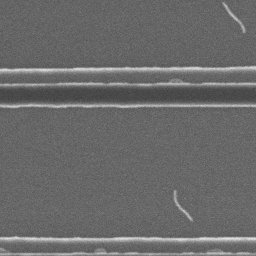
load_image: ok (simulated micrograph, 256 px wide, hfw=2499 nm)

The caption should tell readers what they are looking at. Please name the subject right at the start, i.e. lines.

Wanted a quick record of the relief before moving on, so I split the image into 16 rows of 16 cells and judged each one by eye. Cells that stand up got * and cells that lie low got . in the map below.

................
................
................
................
****************
****************
****************
................
................
................
................
................
................
................
................
****************